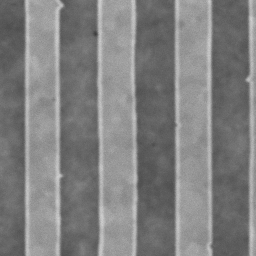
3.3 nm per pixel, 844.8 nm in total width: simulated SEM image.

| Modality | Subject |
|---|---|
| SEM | one or a few lines or trenches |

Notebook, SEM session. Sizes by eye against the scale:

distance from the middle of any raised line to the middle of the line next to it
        250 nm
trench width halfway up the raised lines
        140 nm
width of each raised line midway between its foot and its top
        108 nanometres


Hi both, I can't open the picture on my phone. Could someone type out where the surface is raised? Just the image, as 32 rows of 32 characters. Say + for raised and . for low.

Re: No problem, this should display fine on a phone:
...+++++.....++++.....++++.....+
...++++......++++.....++++.....+
....+++......++++.....++++.....+
....+++......++++.....++++.....+
....+++......++++.....++++.....+
....+++......++++.....++++.....+
....+++......++++.....++++.....+
....+++......++++.....++++......
...++++......++++.....++++......
...++++.....+++++.....++++.....+
...++++.....+++++.....++++.....+
...++++......++++.....++++......
...++++......++++.....++++......
...++++......++++.....++++......
...++++......++++.....++++......
...++++......++++.....++++......
...++++......++++.....++++......
...++++......++++.....++++......
...++++......++++.....++++......
...++++......++++.....++++......
...++++......++++.....++++.....+
...++++......++++.....++++.....+
...++++......++++.....++++.....+
...++++......++++.....++++.....+
...++++......++++.....++++.....+
...++++......++++.....++++.....+
...++++......++++.....++++.....+
...++++......++++.....++++.....+
...++++......++++.....++++.....+
...++++......++++.....++++.....+
...++++......++++.....++++.....+
...++++......++++.....++++.....+